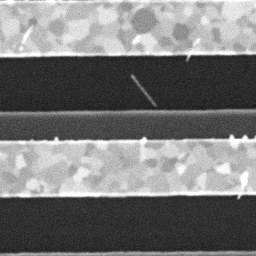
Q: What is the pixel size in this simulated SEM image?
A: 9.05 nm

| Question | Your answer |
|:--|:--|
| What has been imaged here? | lines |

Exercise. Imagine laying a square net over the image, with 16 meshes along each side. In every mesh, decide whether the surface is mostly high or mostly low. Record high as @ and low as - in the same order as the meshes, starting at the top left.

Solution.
@@@@@@@@@@@@@@@@
@@@@@@@@@@@@@@@@
@@@@@@@@@@@@@@@@
----------------
----------------
----------------
----------------
@@@@@@@@@@@@@@@@
@@@@@@@@@@@@@@@@
@@@@@@@@@@@@@@@@
@@@@@@@@@@@@@@@@
@@@@@@@@@@@@@@@@
----------------
----------------
----------------
----------------